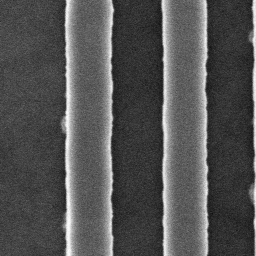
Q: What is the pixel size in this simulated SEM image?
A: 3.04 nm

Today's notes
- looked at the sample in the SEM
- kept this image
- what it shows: lines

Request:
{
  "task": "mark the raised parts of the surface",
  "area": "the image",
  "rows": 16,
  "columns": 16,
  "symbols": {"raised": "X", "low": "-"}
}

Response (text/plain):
----XXX---XXX---
----XXX---XXX---
----XXX---XXX---
----XXX---XXX---
----XXX---XXX---
----XXX---XXX---
----XXX---XXX---
----XXX---XXX---
----XXX---XXX---
----XXX---XXX---
----XXX---XXX---
----XXX---XXX---
----XXX---XXX---
----XXX---XXX---
----XXX---XXX---
----XXX---XXX---